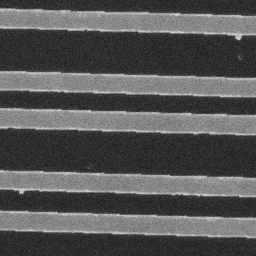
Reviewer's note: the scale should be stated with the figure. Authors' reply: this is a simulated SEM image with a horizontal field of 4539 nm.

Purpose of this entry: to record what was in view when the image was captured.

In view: lines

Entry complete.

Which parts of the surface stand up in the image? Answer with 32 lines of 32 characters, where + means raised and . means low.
................................
++++++++++++....................
++++++++++++++++++++++++++++++++
++++++++++++++++++++++++++++++++
.............................+..
................................
................................
................................
................................
++++++++++++++++++++............
++++++++++++++++++++++++++++++++
............++++++++++++++++++++
................................
................................
++++++++++++++++++++++++++++++++
++++++++++++++++++++++++++++++++
.....................+++++++++++
................................
................................
................................
................................
+++++...........................
++++++++++++++++++++++++++++++++
++++++++++++++++++++++++++++++++
..............................++
................................
++++............................
++++++++++++++++++++++++++++++++
++++++++++++++++++++++++++++++++
..........................++++++
................................
................................